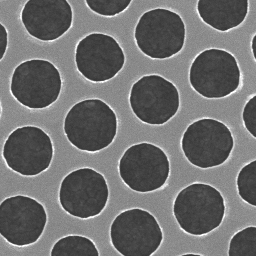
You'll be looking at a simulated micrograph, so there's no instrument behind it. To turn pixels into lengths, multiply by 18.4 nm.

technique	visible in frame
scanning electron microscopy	a regular array of holes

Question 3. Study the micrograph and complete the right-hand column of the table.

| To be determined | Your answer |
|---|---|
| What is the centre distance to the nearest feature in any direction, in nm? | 1210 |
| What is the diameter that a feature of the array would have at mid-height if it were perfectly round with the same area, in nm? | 915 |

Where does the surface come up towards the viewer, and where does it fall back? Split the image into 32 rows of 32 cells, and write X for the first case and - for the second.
XXX------XX-----XXXXXXXXX------X
XXX------XXX---XXX---XXXX------X
XXX------XXXXXXXX------XX-----XX
-XX------XXXXXXXX------XXXX--XXX
-XXX----XXX---XXX------XXXXXXXXX
-XXXXXXXXX-----XX------XXXXXXXX-
-XXXXXXXX------XXX----XXX---XXXX
XXXX-XXXX-------XXXXXXXX-----XXX
XX-----XXX-----XXXXXXXXX------XX
XX-----XXXX---XXXXX-XXXX------XX
X-------XXXXXXXXX-----XX------XX
X------XXXXXXXXX------XXX----XXX
XX-----XXXX-XXXX------XXXXXXXXX-
XXXX-XXXX-----XX------XXXXXXXXX-
XXXXXXXX------XXX-----XXXXXXXX--
XXXXXXXX-------XXXX-XXXX----XXX-
XX---XXX------XXXXXXXXX------XX-
X-----XXX-----XXXXXXXXX------XXX
-------XXX---XXX----XXX------XXX
------XXXXXXXXX------XX------XXX
X-----XXXXXXXXX------XXX----XXX-
XX---XXXX---XXX------XXXXXXXXX--
XXXXXXXX-----XX------XXXXXXXXX--
XXXXXXXX-----XXX----XXX----XXX--
XX-XXXX-------XXXXXXXX------XX--
-----XXX-----XXXXXXXXX------XXX-
------XX-----XX---XXXX------XXXX
------XXXXXXXX-----XXX------XXXX
-----XXXXXXXXX------XXX----XXXX-
-----XXXX-XXXX------XXXXXXXXX---
XX--XXX-----XX------XXXXXXXXX---
XXXXXX------XXX----XXXXXXXXXX---